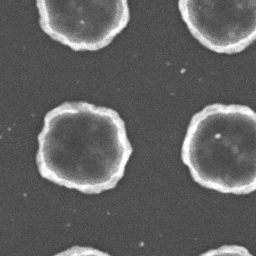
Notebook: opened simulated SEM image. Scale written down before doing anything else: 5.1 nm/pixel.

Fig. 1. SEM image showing raised bodies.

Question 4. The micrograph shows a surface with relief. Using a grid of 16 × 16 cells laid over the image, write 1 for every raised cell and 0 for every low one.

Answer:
0001111100011111
0001111100001111
0000111000000111
0000000000000000
0000000000000000
0000000000000000
0000000000000000
0001111000001111
0001111100001111
0001111100001111
0001111100001111
0000111000000111
0000000000000000
0000000000000000
0000000000000000
0000000000000000